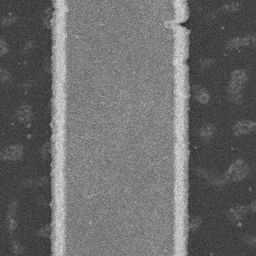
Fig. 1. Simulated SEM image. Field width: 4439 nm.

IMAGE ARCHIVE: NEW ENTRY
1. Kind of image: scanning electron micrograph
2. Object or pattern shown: one or a few lines or trenches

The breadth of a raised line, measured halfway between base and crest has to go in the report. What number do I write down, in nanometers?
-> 2080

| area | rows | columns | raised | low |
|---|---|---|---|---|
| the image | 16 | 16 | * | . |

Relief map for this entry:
....*******.....
....*******.....
....*******.....
....*******.....
....*******.....
....*******.....
....*******.....
....*******.....
....*******.....
....*******.....
....*******.....
....*******.....
....*******.....
....*******.....
....*******.....
....*******.....